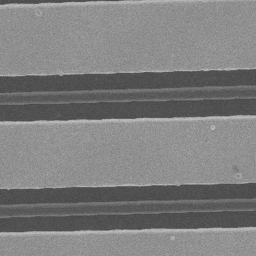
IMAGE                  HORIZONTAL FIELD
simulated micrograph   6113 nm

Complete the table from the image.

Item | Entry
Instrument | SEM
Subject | lines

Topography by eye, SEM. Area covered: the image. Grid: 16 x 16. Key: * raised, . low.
****************
****************
****************
****************
*********.......
................
................
.......*********
****************
****************
****************
************....
................
................
.....***********
****************